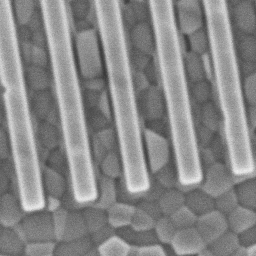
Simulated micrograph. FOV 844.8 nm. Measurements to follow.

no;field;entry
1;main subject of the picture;parallel lines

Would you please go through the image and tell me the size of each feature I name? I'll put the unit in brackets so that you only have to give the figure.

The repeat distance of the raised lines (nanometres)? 175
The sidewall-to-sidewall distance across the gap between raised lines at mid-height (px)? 33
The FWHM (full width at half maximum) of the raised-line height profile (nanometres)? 67.5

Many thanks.